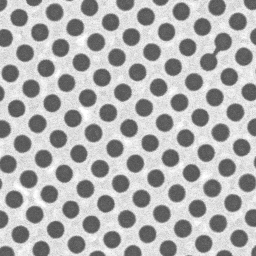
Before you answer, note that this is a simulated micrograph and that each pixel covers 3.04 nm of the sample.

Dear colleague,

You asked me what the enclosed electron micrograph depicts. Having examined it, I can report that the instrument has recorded a regular array of holes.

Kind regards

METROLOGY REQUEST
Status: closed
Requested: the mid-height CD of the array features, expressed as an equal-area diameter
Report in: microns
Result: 0.0541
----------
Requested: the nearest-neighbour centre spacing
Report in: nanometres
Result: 75.8